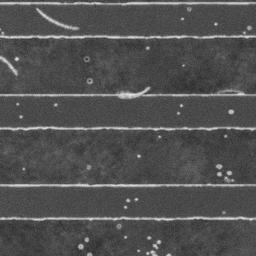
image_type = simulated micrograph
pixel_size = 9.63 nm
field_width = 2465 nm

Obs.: lines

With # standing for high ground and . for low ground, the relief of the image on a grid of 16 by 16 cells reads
################
################
................
................
................
................
################
################
................
................
................
................
################
################
................
................